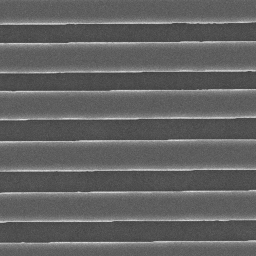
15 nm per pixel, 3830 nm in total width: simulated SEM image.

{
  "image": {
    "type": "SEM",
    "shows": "lines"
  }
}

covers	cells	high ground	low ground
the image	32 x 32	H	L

HHHHHHHHHHHHHHHHHHHHHHHHHHHHHHHH
HHHHHHHHHHHHHHHHHHHHHHHHHHHHHHHH
HHHHHHHHHHHHHHHHHHHHHHHHHHHHHHHH
LLLLLLLLLLLLLLLLLLLLLLLLLLLLLLLL
LLLLLLLLLLLLLLLLLLLLLLLLLLLLLLLL
HHHHHHHHHHHHHHHHHHHHHHHHHHHHHHHH
HHHHHHHHHHHHHHHHHHHHHHHHHHHHHHHH
HHHHHHHHHHHHHHHHHHHHHHHHHHHHHHHH
HHHHHHHHHHHHHHHHHHHHHHHHHHHHHHHH
LLLLLLLLLLLLLLLLLLLLLLLLLLLLLLLL
LLLLLLLLLLLLLLLLLLLLLLLLLLLLLLLL
HHHHHHHHHHHHHHHHHHHHHHHHHHHHHHHH
HHHHHHHHHHHHHHHHHHHHHHHHHHHHHHHH
HHHHHHHHHHHHHHHHHHHHHHHHHHHHHHHH
HHHHHHHHHHHHHHHHHHHHHHHHHHHHHHHH
LLLLLLLLLLLLLLLLLLLLLLLLLLLLLLLL
LLLLLLLLLLLLLLLLLLLLLLLLLLLLLLLL
LLLLLLLLLLLLLLLLLLLLLLLLLLLLLLLL
HHHHHHHHHHHHHHHHHHHHHHHHHHHHHHHH
HHHHHHHHHHHHHHHHHHHHHHHHHHHHHHHH
HHHHHHHHHHHHHHHHHHHHHHHHHHHHHHHH
LLLLLLLLLLLLLLLLLLLLLLLLLLLLLLLL
LLLLLLLLLLLLLLLLLLLLLLLLLLLLLLLL
LLLLLLLLLLLLLLLLLLLLLLLLLLLLLLLL
HHHHHHHHHHHHHHHHHHHHHHHHHHHHHHHH
HHHHHHHHHHHHHHHHHHHHHHHHHHHHHHHH
HHHHHHHHHHHHHHHHHHHHHHHHHHHHHHHH
HHHHHHHHHHHHHHHHHHHHHHHHHHHHHLLL
LLLLLLLLLLLLLLLLLLLLLLLLLLLLLLLL
LLLLLLLLLLLLLLLLLLLLLLLLLLLLLLLL
HHHHHHHHHHHHHHHHHHHHHHHHHHHHHHHH
HHHHHHHHHHHHHHHHHHHHHHHHHHHHHHHH